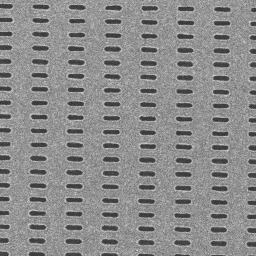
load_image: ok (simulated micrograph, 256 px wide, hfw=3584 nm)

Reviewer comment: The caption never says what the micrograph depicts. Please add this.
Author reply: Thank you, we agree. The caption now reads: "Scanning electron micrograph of a regular array of holes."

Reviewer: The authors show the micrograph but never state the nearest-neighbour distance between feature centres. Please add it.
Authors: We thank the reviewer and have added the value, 192 nm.